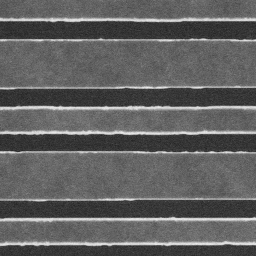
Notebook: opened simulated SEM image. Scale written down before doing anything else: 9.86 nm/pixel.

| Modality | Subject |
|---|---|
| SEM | lines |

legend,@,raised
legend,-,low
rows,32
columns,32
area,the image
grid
@@@@@@@@@@@@@@@@@@@@@@@@@@@@@@@@
@@@@@@@@@@@@@@@@@@@@@@@@@@@@@@@@
@@@@@@@@@@@@@--@@@@@@@@@@@@@@@@@
--------------------------------
--------------------------------
@@@@@@@@@@@@@@@@@@@@@@@@@@@@@@@@
@@@@@@@@@@@@@@@@@@@@@@@@@@@@@@@@
@@@@@@@@@@@@@@@@@@@@@@@@@@@@@@@@
@@@@@@@@@@@@@@@@@@@@@@@@@@@@@@@@
@@@@@@@@@@@@@@@@@@@@@@@@@@@@@@@@
@@@@@@@@@@@@@@@@@@@@@@@@@@@@@@@@
--------------------------------
--------------------------------
@@@@@@@@@@@@@@@@@@@@@@@@@@@@@@@@
@@@@@@@@@@@@@@@@@@@@@@@@@@@@@@@@
@@@@@@@@@@@@@@@@@@@@@@@@@@@@@@@@
@@@@@@@@@@@@@@@@@@@@@@@@@@@@@@@@
--------------------------------
--------------------------------
@@@@@@@@@@@@@@@@@@@@@@@@@@@@@@@@
@@@@@@@@@@@@@@@@@@@@@@@@@@@@@@@@
@@@@@@@@@@@@@@@@@@@@@@@@@@@@@@@@
@@@@@@@@@@@@@@@@@@@@@@@@@@@@@@@@
@@@@@@@@@@@@@@@@@@@@@@@@@@@@@@@@
@@@@@@@@@@@@@@@@@@@@@@@@@@@@@@@@
--------------------------------
--------------------------------
@@@@@@@@@@@@@@@@@@@@@@@@@@@@@@@@
@@@@@@@@@@@@@@@@@@@@@@@@@@@@@@@@
@@@@@@@@@@@@@@@@@@@@@@@@@@@@@@@@
@@@@@@@@@@@@@@@@@@@@@@@@@@@@-@@@
--------------------------------